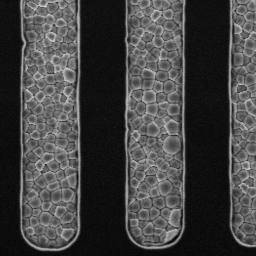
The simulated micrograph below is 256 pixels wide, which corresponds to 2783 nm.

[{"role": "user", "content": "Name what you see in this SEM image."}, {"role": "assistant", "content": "one or a few lines or trenches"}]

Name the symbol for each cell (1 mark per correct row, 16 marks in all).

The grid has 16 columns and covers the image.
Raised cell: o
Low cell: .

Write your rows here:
o....ooo...ooo..
o....ooo...ooo..
oo...ooo...ooo..
o....ooo...ooo..
o....ooo...ooo..
o....ooo...ooo..
o....ooo...ooo..
o....ooo...ooo..
o....ooo...ooo..
o....ooo...ooo..
o....ooo...ooo..
o....ooo...ooo..
o....ooo...ooo..
o....ooo...ooo..
o....ooo...oooo.
ooo.oooooooooooo